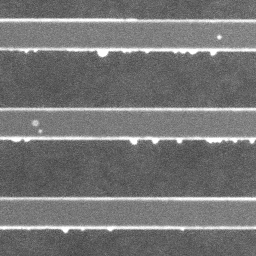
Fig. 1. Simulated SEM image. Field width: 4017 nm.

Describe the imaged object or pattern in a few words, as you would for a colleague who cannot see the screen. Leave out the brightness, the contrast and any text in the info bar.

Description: lines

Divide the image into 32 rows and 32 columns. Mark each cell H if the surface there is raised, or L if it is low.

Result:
LLLLLLLLLLLLLLLLLLLLLLLLLLLLLLLL
LLLLLLLLLLLLLLLLLLLLLLLLLLLLLLLL
HHHHHHHHHHHHHHHLHLLLLLLLLLLLLLLL
HHHHHHHHHHHHHHHHHHHHHHHHHHHHHHHH
HHHHHHHHHHHHHHHHHHHHHHHHHHHHHHHH
HHHHHHHHHHHHHHHHHHHHHHHHHHHHHHHH
LLLLLLLLLLLLHHLLLLLLLLLLLLHLLLLL
LLLLLLLLLLLLLLLLLLLLLLLLLLLLLLLL
LLLLLLLLLLLLLLLLLLLLLLLLLLLLLLLL
LLLLLLLLLLLLLLLLLLLLLLLLLLLLLLLL
LLLLLLLLLLLLLLLLLLLLLLLLLLLLLLLL
LLLLLLLLLLLLLLLLLLLLLLLLLLLLLLLL
LLLLLLLLLLLLLLLLLLLLLLLLLLLLLLLL
LLLLLLLLLLLLLLLLLLLLLLLLLLLLLLLL
HHHHHHHHHHHHHHHHHHHHHHHHHHHHHHHH
HHHHHHHHHHHHHHHHHHHHHHHHHHHHHHHH
HHHHHHHHHHHHHHHHHHHHHHHHHHHHHHHH
LLLLLLLLLLLLLLLLHLLLLLLLLLLLLLLL
LLLLLLLLLLLLLLLLLLLLLLLLLLLLLLLL
LLLLLLLLLLLLLLLLLLLLLLLLLLLLLLLL
LLLLLLLLLLLLLLLLLLLLLLLLLLLLLLLL
LLLLLLLLLLLLLLLLLLLLLLLLLLLLLLLL
LLLLLLLLLLLLLLLLLLLLLLLLLLLLLLLL
LLLLLLLLLLLLLLLLLLLLLLLLLLLLLLLL
LLLLLLLLLLLLLLLLLLLLLLLLLLLLLLLL
HHHHHHHHHHHHHHHHHHHHHHHHHHHHHHHH
HHHHHHHHHHHHHHHHHHHHHHHHHHHHHHHH
HHHHHHHHHHHHHHHHHHHHHHHHHHHHHHHH
HHHHHHHHHHHHHHHHHHHHHHHHHHHHHHHH
LLLLLLLLLLLLLLLLLLLLLLLLLLLLLLLL
LLLLLLLLLLLLLLLLLLLLLLLLLLLLLLLL
LLLLLLLLLLLLLLLLLLLLLLLLLLLLLLLL